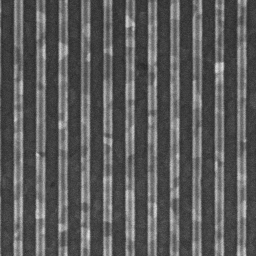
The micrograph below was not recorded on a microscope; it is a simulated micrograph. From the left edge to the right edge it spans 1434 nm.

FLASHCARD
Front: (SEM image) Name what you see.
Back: parallel lines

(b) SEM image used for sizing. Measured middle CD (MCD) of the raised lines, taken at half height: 0.0364 um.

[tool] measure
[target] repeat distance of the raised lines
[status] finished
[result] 125 nm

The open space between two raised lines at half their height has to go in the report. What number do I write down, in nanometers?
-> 87.5